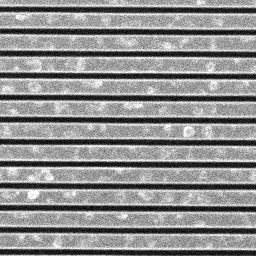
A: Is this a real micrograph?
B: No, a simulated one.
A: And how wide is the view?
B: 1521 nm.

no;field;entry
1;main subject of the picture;parallel lines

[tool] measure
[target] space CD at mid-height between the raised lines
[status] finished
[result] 34.9 nm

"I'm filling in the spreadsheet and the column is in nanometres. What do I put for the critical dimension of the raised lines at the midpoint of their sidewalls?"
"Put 97.2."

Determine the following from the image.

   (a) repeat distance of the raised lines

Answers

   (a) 131 nm